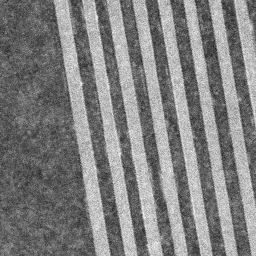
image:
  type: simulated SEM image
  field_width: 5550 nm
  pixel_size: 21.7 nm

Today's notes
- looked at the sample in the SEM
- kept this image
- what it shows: parallel lines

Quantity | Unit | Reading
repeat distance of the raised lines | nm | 548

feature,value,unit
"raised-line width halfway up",0.249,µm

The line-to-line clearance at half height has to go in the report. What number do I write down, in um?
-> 0.305